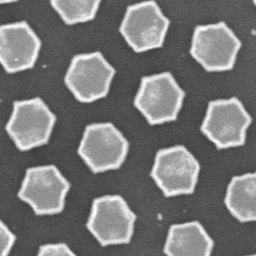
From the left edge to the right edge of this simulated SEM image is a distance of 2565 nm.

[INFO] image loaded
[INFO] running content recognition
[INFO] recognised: a regular array of raised bodies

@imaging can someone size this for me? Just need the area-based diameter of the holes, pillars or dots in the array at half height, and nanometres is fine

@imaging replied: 461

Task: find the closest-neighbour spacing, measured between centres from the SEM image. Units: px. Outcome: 71.2